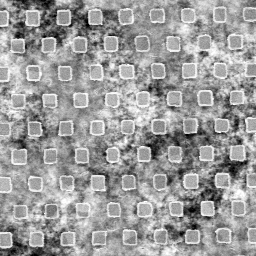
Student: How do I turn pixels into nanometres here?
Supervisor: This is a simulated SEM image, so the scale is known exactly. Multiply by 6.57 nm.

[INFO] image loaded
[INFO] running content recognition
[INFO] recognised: a regular array of raised bodies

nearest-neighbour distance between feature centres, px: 31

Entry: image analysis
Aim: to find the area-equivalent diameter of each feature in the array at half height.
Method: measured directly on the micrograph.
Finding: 99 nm